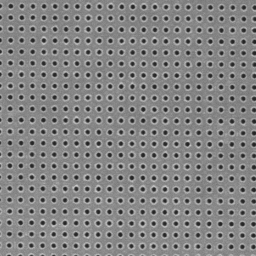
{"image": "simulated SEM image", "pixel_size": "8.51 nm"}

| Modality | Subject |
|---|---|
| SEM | a regular array of holes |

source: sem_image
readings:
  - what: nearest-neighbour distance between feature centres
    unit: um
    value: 0.0936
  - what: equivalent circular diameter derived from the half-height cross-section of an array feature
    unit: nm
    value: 43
